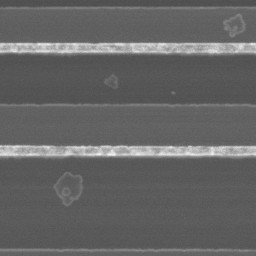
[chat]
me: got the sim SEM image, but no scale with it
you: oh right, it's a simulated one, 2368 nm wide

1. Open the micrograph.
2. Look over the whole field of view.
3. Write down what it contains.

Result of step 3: lines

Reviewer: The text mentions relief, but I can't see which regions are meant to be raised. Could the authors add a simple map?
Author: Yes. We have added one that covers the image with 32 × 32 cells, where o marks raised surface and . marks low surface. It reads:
................................
oooooooooooooooooooooooooooooooo
oooooooooooooooooooooooooooooooo
oooooooooooooooooooooooooooooooo
oooooooooooooooooooooooooooooooo
oooooooooooooooooooooooooooooooo
..o.o..ooo........oooooo..oooo.o
................................
................................
................................
................................
................................
................................
oooooooooooooooooooooooooooooooo
oooooooooooooooooooooooooooooooo
oooooooooooooooooooooooooooooooo
oooooooooooooooooooooooooooooooo
oooooooooooooooooooooooooooooooo
oooooooooooooooooooooooooooooooo
................................
................................
................................
................................
................................
................................
................................
................................
................................
................................
................................
................................
oooooooooooooooooooooooooooooooo